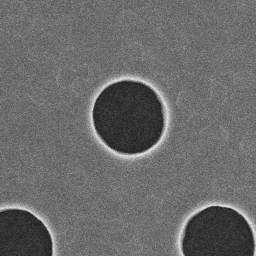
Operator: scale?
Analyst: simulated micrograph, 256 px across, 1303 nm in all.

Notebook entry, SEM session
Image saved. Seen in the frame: holes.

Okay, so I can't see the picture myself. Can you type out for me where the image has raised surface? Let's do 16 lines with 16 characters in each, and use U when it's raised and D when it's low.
UUUUUUUUUUUUUUUU
UUUUUUUUUUUUUUUU
UUUUUUUUUUUUUUUU
UUUUUUUUUUUUUUUU
UUUUUUUUUUUUUUUU
UUUUUUUDDUUUUUUU
UUUUUUDDDDUUUUUU
UUUUUUDDDDUUUUUU
UUUUUUDDDDUUUUUU
UUUUUUUDDUUUUUUU
UUUUUUUUUUUUUUUU
UUUUUUUUUUUUUUUU
UUUUUUUUUUUUUUUU
DDUUUUUUUUUUDDDU
DDDUUUUUUUUDDDDD
DDDUUUUUUUUDDDDD